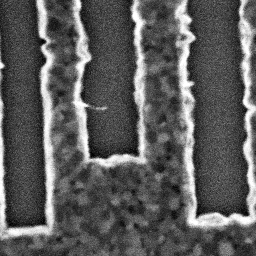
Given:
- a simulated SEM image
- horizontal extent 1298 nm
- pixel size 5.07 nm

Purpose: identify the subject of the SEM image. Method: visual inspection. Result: one or a few lines or trenches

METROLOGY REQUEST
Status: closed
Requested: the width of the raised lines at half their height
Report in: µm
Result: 0.21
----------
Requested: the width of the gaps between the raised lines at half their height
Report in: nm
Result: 297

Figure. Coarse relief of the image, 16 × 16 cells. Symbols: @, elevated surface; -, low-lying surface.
---@@---@@@----@
---@@----@@----@
---@@----@@@---@
---@@----@@@---@
---@@----@@----@
---@@----@@@---@
---@@----@@@---@
---@@----@@@---@
---@@----@@@----
---@@----@@@---@
---@@@@@@@@@----
---@@@@@@@@@----
---@@@@@@@@@----
---@@@@@@@@@---@
@@@@@@@@@@@@@@@@
@@@@@@@@@@@@@@@@